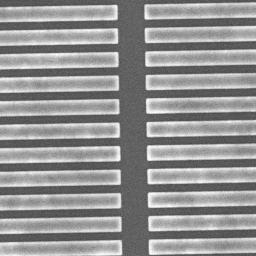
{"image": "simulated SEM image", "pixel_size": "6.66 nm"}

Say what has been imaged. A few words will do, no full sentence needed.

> groups of lines, slits or small figures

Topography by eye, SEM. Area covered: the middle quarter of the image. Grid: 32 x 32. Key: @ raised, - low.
@@@@@@@@@@@@@--------@@@--------
--------------------------------
--------------------------------
@@@@@@@@@@@@@--------@@@@@@@@@@@
@@@@@@@@@@@@@--------@@@@@@@@@@@
@@@@@@@@@@@@@--------@@@@@@@@@@@
@@@@@---------------------------
--------------------------------
--------------------------------
@@@@@@@@@@@@@@-------@@@@@@@@@@@
@@@@@@@@@@@@@@-------@@@@@@@@@@@
@@@@@@@@@@@@@@-------@@@@@@@@@@@
--------------------------------
--------------------------------
----------------------------@@@@
@@@@@@@@@@@@@@-------@@@@@@@@@@@
@@@@@@@@@@@@@@-------@@@@@@@@@@@
@@@@@@@@@@@@@@-------@@@@@@@@@@@
--------------------------------
--------------------------------
-----------------------@@@@@@@@@
@@@@@@@@@@@@@@-------@@@@@@@@@@@
@@@@@@@@@@@@@@-------@@@@@@@@@@@
@@@@@@@@@@@@@@-------@@@@@@@@@@@
--------------------------------
--------------------------------
---------------------@@@@@@@@@@@
@@@@@@@@@@@@@@-------@@@@@@@@@@@
@@@@@@@@@@@@@@-------@@@@@@@@@@@
@@@@@@@@@@@@@@-------@@@@@@@@@@@
--------------------------------
--------------------------------